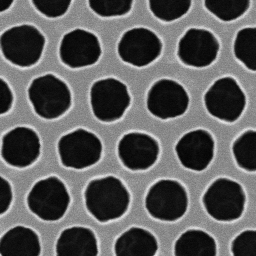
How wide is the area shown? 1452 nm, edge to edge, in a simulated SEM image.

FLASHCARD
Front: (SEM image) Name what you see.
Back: a regular array of holes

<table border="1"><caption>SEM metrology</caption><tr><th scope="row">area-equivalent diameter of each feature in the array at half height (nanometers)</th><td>234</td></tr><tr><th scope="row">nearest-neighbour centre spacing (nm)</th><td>327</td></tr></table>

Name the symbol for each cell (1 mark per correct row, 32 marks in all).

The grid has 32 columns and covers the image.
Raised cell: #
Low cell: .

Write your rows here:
.###.....##.....###.....##.....#
#####...####....###....###.....#
#####################.######.###
##..#############.#############.
.....###....###.....###....###..
......##....###.....##.....##...
.....##......##.....##.....##...
#....###....###....####....###..
###############################.
#####..#########################
.###....####...####...#####...##
.###.....##.....###....###....##
..##.....##.....##......##.....#
.###.....###....##.....###....##
#####..#####...####...#####...##
################################
#...#####..#############..#####.
.....##.....###....###.....###..
.....##......##.....##.....##...
.....###.....##.....##.....##...
#...####....####...####...####..
################################
.####..#####...#####.######..###
.###....###.....###....###....##
..##.....##.....##.....###.....#
.##......##.....##.....###.....#
.###....###.....###....###....##
#####..#####..######..#####..###
##.######..#####################
.....##.....###....####...####..
.....##.....##......##.....##...
.....##.....##......##.....##...